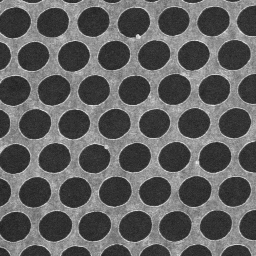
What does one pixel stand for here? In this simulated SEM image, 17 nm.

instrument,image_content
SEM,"a regular array of holes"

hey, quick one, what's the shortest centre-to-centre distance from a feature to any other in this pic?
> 39 pixels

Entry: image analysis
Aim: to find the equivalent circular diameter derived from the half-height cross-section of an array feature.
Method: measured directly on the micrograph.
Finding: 538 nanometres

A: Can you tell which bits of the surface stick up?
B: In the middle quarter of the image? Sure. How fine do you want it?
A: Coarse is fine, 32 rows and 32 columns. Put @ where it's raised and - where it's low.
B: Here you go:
-----@@@@------@@@@------@@@@---
----@@@@@@@--@@@@@@@@--@@@@@@@@-
@@@@@@@@@@@@@@@@@@@@@@@@@@@--@@@
@@@@@-----@@@@@-----@@@@@------@
-@@@-------@@@-------@@@--------
--@@-------@@@--------@@--------
--@---------@---------@---------
-@@--------@@@-------@@@--------
-@@@-------@@@-------@@@-------@
@@@@@-----@@@@@-----@@@@@-----@@
@@@@@@@@@@@@@@@@@-@@@@@@@@@@@@@@
@---@@@@@@@----@@@@@@----@@@@@@-
------@@@@------@@@@------@@@@--
------@@@--------@@-------@@@---
-------@---------@@--------@----
-------@---------@@--------@----
------@@@-------@@@-------@@@---
-----@@@@------@@@@@-----@@@@---
----@@@@@@----@@@@@@@---@@@@@@@-
@@@@@@@@@@@@@@@@@@@@@@@@@@@--@@@
@@@@@@----@@@@@@-----@@@@------@
-@@@@------@@@--------@@-------@
--@@--------@@--------@@--------
--@@--------@---------@---------
--@@--------@@--------@@-------@
-@@@-------@@@-------@@@-------@
@@@@@-----@@@@@-----@@@@@-----@@
@@@@@@@@@@@@@@@@@@@@@@@@@@@@@@@@
@---@@@@@@@----@@@@@@@---@@@@@@-
------@@@@------@@@@------@@@@--
-------@@--------@@--------@@---
-------@@--------@@--------@@---